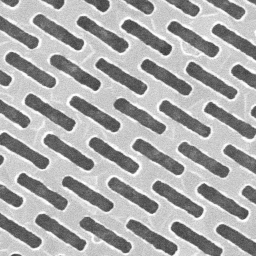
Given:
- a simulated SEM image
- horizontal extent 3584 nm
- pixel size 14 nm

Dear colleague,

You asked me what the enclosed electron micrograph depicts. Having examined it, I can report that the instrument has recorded a regular array of holes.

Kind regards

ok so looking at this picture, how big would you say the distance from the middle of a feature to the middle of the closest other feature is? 43.8 pixels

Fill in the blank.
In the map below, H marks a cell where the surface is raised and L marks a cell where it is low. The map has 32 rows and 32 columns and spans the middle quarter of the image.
LLLLHHHHLLLLLHHHHHHLLLLLHHHHHHHL
LLLLLHHHHLLLLLLHHHHLLLLLLLHHHHLL
LLLLLLLHHHLLLLLLHHHHHLLLLLLHHHHL
HHLLLLLLHHHHLLLLLLHHHHLLLLLLLHHH
HHHLLLLLLHHHHLLLLLLLHHHHHLLLLLLH
HHHHHLLLLHHHHHHLLLLLLHHHHHLLLLLL
HHHHHHHLLHHHHHHHLLLLLHHHHHHHLLLL
HHHHHHHHHHHHHHHHHHLLHHHHHHHHHLLH
HHLLLHHHHHHHHHLHHHHHHHHHHHHHHHHH
HLLLLLHHHHHHLLLLLHHHHHHHLLLHHHHH
HLLLLLLLHHHHLLLLLLHHHHHHLLLLHHHH
HHHLLLLLLHHHHLLLLLLLHHHHLLLLLLHH
HHHHLLLLLLLHHHHLLLLLLHHHHLLLLLLH
LLHHHHLLLLLLHHHHLLLLLLLHHHHLLLLL
LLLHHHHHLLLLLLHHHHLLLLLLHHHHLLLL
LLLHHHHHHLLLLLHHHHHHLLLLLHHHHHLL
LLHHHHHHHHHLLLHHHHHHHLLLLHHHHHHL
HHHHHHHHHHHHHHHHHHHHHHHLHHHHHHHH
HHHHHHHLLHHHHHHHHHHHHHHHHHHHHHHH
HHHHHHLLLLHHHHHHHLLLLHHHHHHHHLLH
LLHHHHLLLLLLHHHHHLLLLLHHHHHHHLLL
LLLHHHHLLLLLLLHHHLLLLLLLHHHHLLLL
LLLLLHHHHLLLLLLHHHHLLLLLLLHHHLLL
LLLLLLLHHHLLLLLLLHHHHLLLLLLHHHHL
HHLLLLLHHHHHLLLLLLHHHHLLLLLLLHHH
HHHLLLLLHHHHHHLLLLLHHHHHLLLLLLHH
HHHHHLLHHHHHHHHLLLLHHHHHHHLLLLHH
HHHHHHHHHHHHHHHHHLHHHHHHHHHLLHHH
LLLHHHHHHHHHLLHHHHHHHHHHHHHHHHHH
LLLLHHHHHHHLLLLHHHHHHHLLLHHHHHHH
LLLLLLHHHHHLLLLLLHHHHHLLLLLHHHHH
HLLLLLLLHHHHLLLLLLHHHHLLLLLLHHHH